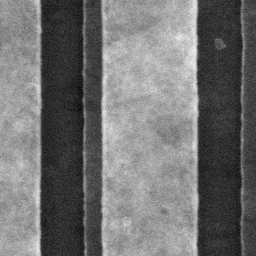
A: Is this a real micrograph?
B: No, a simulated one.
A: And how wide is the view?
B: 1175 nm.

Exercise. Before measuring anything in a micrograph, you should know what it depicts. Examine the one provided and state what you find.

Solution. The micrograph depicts lines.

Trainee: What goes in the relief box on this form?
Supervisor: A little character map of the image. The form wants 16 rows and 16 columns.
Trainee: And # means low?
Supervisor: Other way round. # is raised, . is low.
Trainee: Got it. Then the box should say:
###...######....
###...######....
###...######....
###...######....
###...######....
###...######....
###...######....
###...######....
###...######....
###...######....
###...######....
###...######....
##....######....
##....######....
##....######....
###...######....